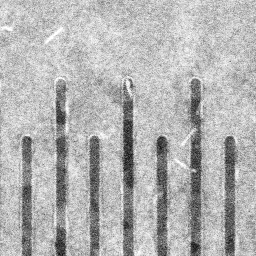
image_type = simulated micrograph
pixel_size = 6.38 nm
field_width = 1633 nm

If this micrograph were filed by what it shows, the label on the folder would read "parallel lines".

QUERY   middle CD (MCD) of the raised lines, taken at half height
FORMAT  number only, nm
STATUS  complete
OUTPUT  74.9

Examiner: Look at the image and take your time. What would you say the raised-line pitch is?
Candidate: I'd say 216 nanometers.